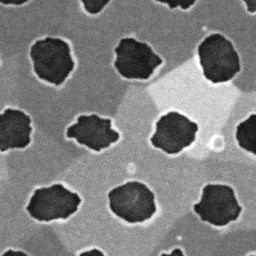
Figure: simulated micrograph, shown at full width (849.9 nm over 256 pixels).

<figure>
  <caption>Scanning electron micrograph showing a regular array of holes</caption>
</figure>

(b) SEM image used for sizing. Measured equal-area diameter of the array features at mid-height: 145 nm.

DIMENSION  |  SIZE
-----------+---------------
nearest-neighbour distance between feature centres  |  270 nm